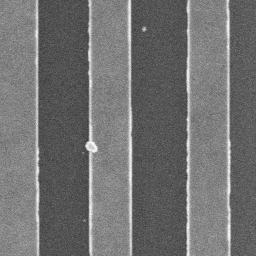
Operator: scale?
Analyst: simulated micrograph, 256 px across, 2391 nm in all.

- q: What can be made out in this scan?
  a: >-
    lines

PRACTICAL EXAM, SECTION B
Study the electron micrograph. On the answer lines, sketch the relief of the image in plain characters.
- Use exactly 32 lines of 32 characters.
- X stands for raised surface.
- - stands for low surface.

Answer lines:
XXXXX------XXXXX-------XXXXXX---
XXXXX------XXXXX-------XXXXXX---
XXXXX------XXXXX--------XXXXX---
XXXXX------XXXXX-------XXXXXX---
XXXXX------XXXXX--------XXXXX---
XXXXX------XXXXX--------XXXXX---
XXXXX------XXXXX--------XXXXX---
XXXXX------XXXXX-------XXXXXX---
XXXXX------XXXXX-------XXXXXX---
XXXXX------XXXXX-------XXXXXX---
XXXXX------XXXXX-------XXXXXX---
XXXXX------XXXXX-------XXXXXX---
XXXXX------XXXXX--------XXXXX---
XXXXX------XXXXX--------XXXXX---
XXXXX------XXXXX-------XXXXXX---
XXXXX------XXXXX-------XXXXXX---
XXXXX------XXXXX-------XXXXXX---
XXXXX------XXXXX-------XXXXXX---
XXXXX------XXXXX-------XXXXXX---
XXXXX------XXXXX-------XXXXXX---
XXXXX------XXXXX-------XXXXXX---
XXXXX------XXXXX-------XXXXXX---
XXXXX------XXXXX-------XXXXXX---
XXXXX------XXXXX-------XXXXXX---
XXXXX------XXXXX-------XXXXXX---
XXXXX------XXXXX-------XXXXXX---
XXXXX------XXXXX-------XXXXXX---
XXXXX------XXXXX-------XXXXXX---
XXXXX------XXXXX-------XXXXXX---
XXXXX------XXXXX-------XXXXXX---
XXXXX------XXXXX-------XXXXXX---
XXXXX------XXXXX-------XXXXXX---